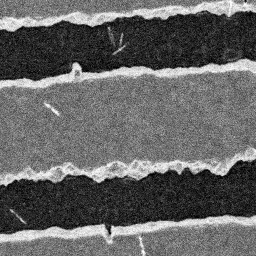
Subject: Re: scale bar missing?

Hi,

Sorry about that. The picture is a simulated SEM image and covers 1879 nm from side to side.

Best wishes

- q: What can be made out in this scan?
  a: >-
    one or a few lines or trenches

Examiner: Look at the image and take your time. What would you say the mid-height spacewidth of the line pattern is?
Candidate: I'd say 418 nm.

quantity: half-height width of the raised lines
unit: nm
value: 709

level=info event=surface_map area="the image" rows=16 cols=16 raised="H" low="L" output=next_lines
HHHHHHHHHHHHHLLH
HHLLLLLLLLLLLLLL
LLLLLLLLLLLLLLLL
LLLLLLLLLLLLLLLL
LLLLLLLHHHHHHHHH
HHHHHHHHHHHHHHHH
HHHHHHHHHHHHHHHH
HHHHHHHHHHHHHHHH
HHHHHHHHHHHHHHHH
HHHHHHHHHHHHHHHH
HHHHHHHLHHLLHHLL
LLLLLLLLLLLLLLLL
LLLLLLLLLLLLLLLL
LLLLLLLLLLLLLLLL
LLLLLHLHHHHHHHHH
HHHHHHHHHHHHHHHH